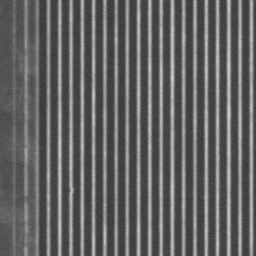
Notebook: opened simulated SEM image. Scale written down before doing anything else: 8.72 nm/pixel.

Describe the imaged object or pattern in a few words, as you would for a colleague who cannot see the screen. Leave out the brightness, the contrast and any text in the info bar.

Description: parallel lines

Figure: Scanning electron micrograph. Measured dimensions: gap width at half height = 0.0807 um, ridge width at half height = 16.4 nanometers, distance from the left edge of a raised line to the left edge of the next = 98.5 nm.